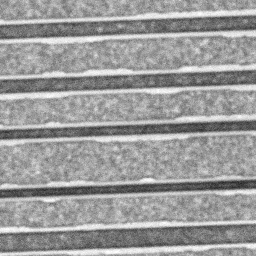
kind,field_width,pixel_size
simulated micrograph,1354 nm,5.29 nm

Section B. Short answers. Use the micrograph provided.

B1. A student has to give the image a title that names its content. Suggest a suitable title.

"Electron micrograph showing parallel lines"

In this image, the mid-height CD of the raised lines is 181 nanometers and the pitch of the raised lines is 52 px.